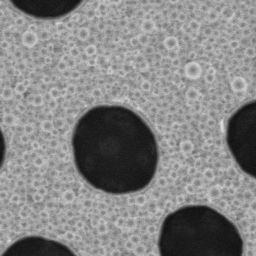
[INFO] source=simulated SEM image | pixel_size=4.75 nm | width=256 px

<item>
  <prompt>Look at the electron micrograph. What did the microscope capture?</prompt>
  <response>holes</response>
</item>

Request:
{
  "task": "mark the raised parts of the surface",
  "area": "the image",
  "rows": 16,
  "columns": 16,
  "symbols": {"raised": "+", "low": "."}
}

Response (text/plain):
+....+++++++++++
++++++++++++++++
++++++++++++++++
++++++++++++++++
++++++++++++++++
++++++++++++++++
+++++++++++++++.
+++++....+++++..
+++++.....++++..
+++++.....++++..
+++++.....+++++.
++++++...+++++++
++++++++++++++++
++++++++++....++
++++++++++.....+
....++++++.....+